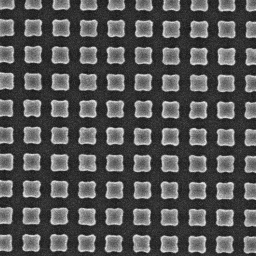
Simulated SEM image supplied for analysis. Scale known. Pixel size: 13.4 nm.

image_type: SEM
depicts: a regular array of raised bodies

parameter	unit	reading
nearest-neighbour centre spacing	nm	359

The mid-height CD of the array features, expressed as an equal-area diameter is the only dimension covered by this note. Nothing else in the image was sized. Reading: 242 nanometres